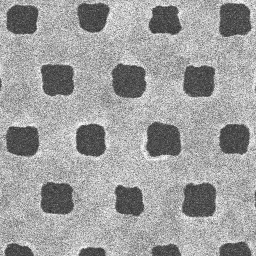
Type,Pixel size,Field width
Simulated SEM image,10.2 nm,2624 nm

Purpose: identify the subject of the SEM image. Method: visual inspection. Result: a regular array of holes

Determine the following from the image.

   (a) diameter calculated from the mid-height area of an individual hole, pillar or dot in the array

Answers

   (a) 347 nanometers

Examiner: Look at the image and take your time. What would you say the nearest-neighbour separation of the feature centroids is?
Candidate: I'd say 0.702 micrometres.